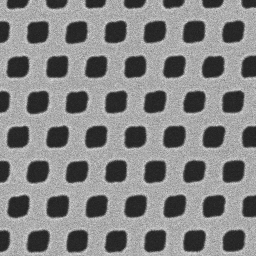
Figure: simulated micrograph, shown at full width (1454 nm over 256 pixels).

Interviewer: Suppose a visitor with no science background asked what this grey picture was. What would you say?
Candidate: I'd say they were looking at a regular array of holes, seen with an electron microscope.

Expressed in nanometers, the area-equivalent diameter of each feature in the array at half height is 132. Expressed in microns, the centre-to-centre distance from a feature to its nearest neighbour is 0.22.